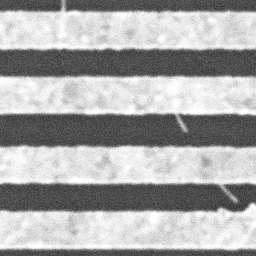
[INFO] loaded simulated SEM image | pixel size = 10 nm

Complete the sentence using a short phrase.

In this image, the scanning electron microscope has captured lines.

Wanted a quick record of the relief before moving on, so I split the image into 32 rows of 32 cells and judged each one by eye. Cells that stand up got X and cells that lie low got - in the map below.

--------------------------------
--------------------------------
XXXXXXXXXXXXXXXXXXXXXXXXXXXXXXXX
XXXXXXXXXXXXXXXXXXXXXXXXXXXXXXXX
XXXXXXXXXXXXXXXXXXXXXXXXXXXXXXXX
XXXXXXXXXXXXXXXXXXXXXXXXXXXXXXXX
--------------------------------
--------------------------------
--------------------------------
--------------------------------
XXXXXXXXXXXXXXXXXXXXXXXXXXXXXXXX
XXXXXXXXXXXXXXXXXXXXXXXXXXXXXXXX
XXXXXXXXXXXXXXXXXXXXXXXXXXXXXXXX
XXXXXXXXXXXXXXXXXXXXXXXXXXXXXXXX
--------------------------------
--------------------------------
--------------------------------
--------------------------------
-XXXXX-XXXX-X--XX---XX----XX----
XXXXXXXXXXXXXXXXXXXXXXXXXXXXXXXX
XXXXXXXXXXXXXXXXXXXXXXXXXXXXXXXX
XXXXXXXXXXXXXXXXXXXXXXXXXXXXXXXX
XXXXXXXXXXXXXXXXXXXXXXXXXXXXXXXX
--------------------------------
--------------------------------
--------------------------------
X-----------------X--------XX-XX
XXXXXXXXXXXXXXXXXXXXXXXXXXXXXXXX
XXXXXXXXXXXXXXXXXXXXXXXXXXXXXXXX
XXXXXXXXXXXXXXXXXXXXXXXXXXXXXXXX
XXXXXXXXXXXXXXXXXXXXXXXXXXXXXXXX
--------------------------------